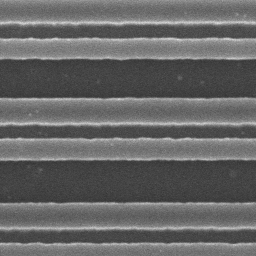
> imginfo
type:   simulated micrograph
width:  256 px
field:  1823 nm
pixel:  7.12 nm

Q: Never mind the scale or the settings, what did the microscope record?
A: lines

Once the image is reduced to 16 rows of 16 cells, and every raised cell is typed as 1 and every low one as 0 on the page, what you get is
1111111111111111
1111111111111111
1111111111111111
1111111111111111
0000000000000000
0000000000000000
1111111111111111
1111111111111111
1111111111111111
1111111111111111
0000000000000000
0000000000000000
0000000000000000
1111111111111111
1111111111111111
1111111111111111